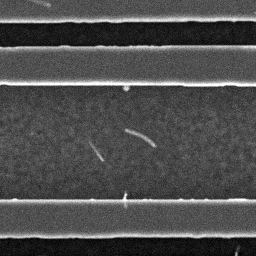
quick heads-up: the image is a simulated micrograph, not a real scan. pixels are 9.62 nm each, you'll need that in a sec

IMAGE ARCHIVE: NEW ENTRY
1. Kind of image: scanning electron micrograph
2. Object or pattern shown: lines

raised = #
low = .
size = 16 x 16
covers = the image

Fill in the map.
################
................
................
################
################
................
................
................
................
................
................
................
#....#.#.#.##.##
################
################
................